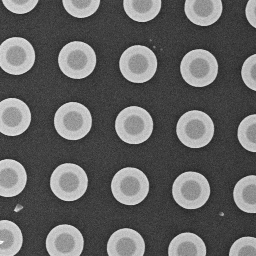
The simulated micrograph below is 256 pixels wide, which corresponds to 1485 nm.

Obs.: an array of small figures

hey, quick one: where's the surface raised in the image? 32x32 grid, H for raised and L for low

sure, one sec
HHHHHLLLHHHHLLLHHHHHLLLHHHHHLLLH
LLHLLLLLLHHHLLLLHHHHLLLHHHHHLLLH
LLLLLLLLLLLLLLLLLHHLLLLLHHHLLLLH
LLLLLLLLLLLLLLLLLLLLLLLLLLLLLLLL
LLLLLLLLLLLLLLLLLLLLLLLLLLLLLLLL
HHHHLLLLHHHLLLLLLLLLLLLLLLLLLLLL
HHHHLLLLHHHHLLLLHHHLLLLLHHLLLLLL
HHHHLLLHHHHHLLLHHHHHLLLHHHHLLLLH
HHHHLLLLHHHHLLLHHHHHLLLHHHHLLLHH
LLLLLLLLHHHLLLLHHHHLLLLHHHHLLLHH
LLLLLLLLLLLLLLLLLLLLLLLLHHLLLLLH
LLLLLLLLLLLLLLLLLLLLLLLLLLLLLLLL
LHLLLLLLLLLLLLLLLLLLLLLLLLLLLLLL
HHHHLLLHHHHLLLLLHHLLLLLLLLLLLLLL
HHHHLLLHHHHLLLLHHHHLLLLHHHLLLLLH
HHHHLLLHHHHLLLHHHHHLLLHHHHHLLLHH
HHHLLLLHHHHLLLLHHHHLLLHHHHHLLLHH
LLLLLLLLLLLLLLLHHHLLLLLHHHLLLLHH
LLLLLLLLLLLLLLLLLLLLLLLLLLLLLLLH
LLLLLLLLLLLLLLLLLLLLLLLLLLLLLLLL
HHHLLLLLHLLLLLLLLLLLLLLLLLLLLLLL
HHHLLLLHHHHLLLLHHHLLLLLLLLLLLLLL
HHHLLLHHHHHLLLHHHHLLLLHHHHLLLLHH
HHHLLLHHHHHLLLHHHHHLLLHHHHLLLHHH
HHLLLLLHHHLLLLHHHHLLLLHHHHLLLHHH
LLLLLLLLLLLLLLLLHLLLLLHHHLLLLLHH
LLLLLLLLLLLLLLLLLLLLLLLLLLLLLLLH
LLLLLLLLLLLLLLLLLLLLLLLLLLLLLLLL
HHLLLLLHHLLLLLLLLLLLLLLLLLLLLLLL
HHHLLLHHHHLLLLHHHHLLLLHHHLLLLLLL
HHHLLLHHHHLLLHHHHHLLLHHHHHLLLHHH
HHLLLLHHHHLLLHHHHHLLLHHHHHLLLHHH